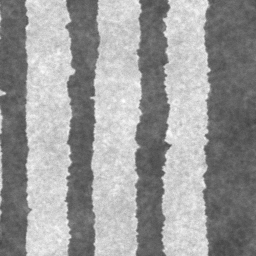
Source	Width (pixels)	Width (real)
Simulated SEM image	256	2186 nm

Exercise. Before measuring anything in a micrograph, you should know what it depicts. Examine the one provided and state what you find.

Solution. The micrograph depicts one or a few lines or trenches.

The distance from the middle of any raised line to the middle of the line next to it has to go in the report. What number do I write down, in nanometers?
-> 581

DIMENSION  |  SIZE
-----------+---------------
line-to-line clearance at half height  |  230 nanometers